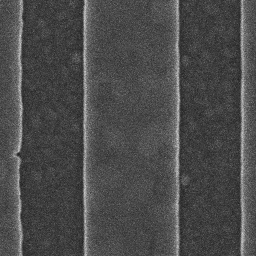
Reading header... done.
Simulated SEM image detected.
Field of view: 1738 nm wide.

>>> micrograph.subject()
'one or a few lines or trenches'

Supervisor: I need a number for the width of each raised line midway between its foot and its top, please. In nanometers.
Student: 640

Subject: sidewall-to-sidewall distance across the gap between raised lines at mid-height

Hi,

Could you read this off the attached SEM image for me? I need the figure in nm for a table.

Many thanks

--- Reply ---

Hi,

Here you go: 427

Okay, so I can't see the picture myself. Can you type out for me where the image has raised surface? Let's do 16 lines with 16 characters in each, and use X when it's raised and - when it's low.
X----XXXXXX----X
X----XXXXXX----X
X----XXXXXX----X
X----XXXXXX----X
X----XXXXXX----X
X----XXXXXX----X
X----XXXXXX----X
X----XXXXXX----X
X----XXXXXX----X
X----XXXXXX----X
X----XXXXXX----X
X----XXXXXX----X
X----XXXXXX----X
X----XXXXXX----X
X----XXXXXX----X
X----XXXXXX----X